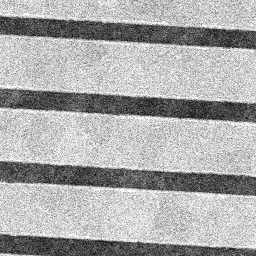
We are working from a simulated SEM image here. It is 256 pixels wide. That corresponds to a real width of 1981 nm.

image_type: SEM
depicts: one or a few lines or trenches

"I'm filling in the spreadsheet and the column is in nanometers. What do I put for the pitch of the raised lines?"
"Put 565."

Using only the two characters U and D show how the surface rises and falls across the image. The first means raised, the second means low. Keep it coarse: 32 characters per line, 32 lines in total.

UUUUUUUUUUUUUUUUUUUUUUUUUUUUUUUU
UUUUUUUUUUUUUUUUUUUUUUUUUUUUUUUU
DDDDDDDDDDDDUUUUUUUUUUUUUUUUUUUU
DDDDDDDDDDDDDDDDDDDDDDDDDDDDDUUU
UDDDDDDDDDDDDDDDDDDDDDDDDDDDDDDD
UUUUUUUUUUUUUUUUUUDDDDDDDDDDDDDD
UUUUUUUUUUUUUUUUUUUUUUUUUUUUUUUU
UUUUUUUUUUUUUUUUUUUUUUUUUUUUUUUU
UUUUUUUUUUUUUUUUUUUUUUUUUUUUUUUU
UUUUUUUUUUUUUUUUUUUUUUUUUUUUUUUU
UUUUUUUUUUUUUUUUUUUUUUUUUUUUUUUU
DDDDDDDDDDUUUUUUUUUUUUUUUUUUUUUU
DDDDDDDDDDDDDDDDDDDDDDDDDDDUUUUU
DDDDDDDDDDDDDDDDDDDDDDDDDDDDDDDD
UUUUUUUUUUUUUUDUDDDDDDDDDDDDDDDD
UUUUUUUUUUUUUUUUUUUUUUUUUUUUUUUD
UUUUUUUUUUUUUUUUUUUUUUUUUUUUUUUU
UUUUUUUUUUUUUUUUUUUUUUUUUUUUUUUU
UUUUUUUUUUUUUUUUUUUUUUUUUUUUUUUU
UUUUUUUUUUUUUUUUUUUUUUUUUUUUUUUU
DDDDDDDDDUUUUUUUUUUUUUUUUUUUUUUU
DDDDDDDDDDDDDDDDDDDDDDDDDDUUUUUU
DDDDDDDDDDDDDDDDDDDDDDDDDDDDDDDD
UUUUUUUUUUUUUDDDDDDDDDDDDDDDDDDD
UUUUUUUUUUUUUUUUUUUUUUUUUUUUDUDD
UUUUUUUUUUUUUUUUUUUUUUUUUUUUUUUU
UUUUUUUUUUUUUUUUUUUUUUUUUUUUUUUU
UUUUUUUUUUUUUUUUUUUUUUUUUUUUUUUU
UUUUUUUUUUUUUUUUUUUUUUUUUUUUUUUU
DDDDDDUUUUUUUUUUUUUUUUUUUUUUUUUU
DDDDDDDDDDDDDDDDDDDDDDDUUUUUUUUU
DDDDDDDDDDDDDDDDDDDDDDDDDDDDDDDD